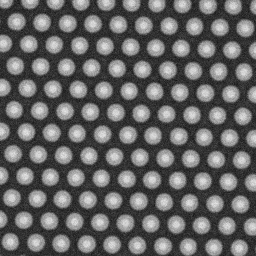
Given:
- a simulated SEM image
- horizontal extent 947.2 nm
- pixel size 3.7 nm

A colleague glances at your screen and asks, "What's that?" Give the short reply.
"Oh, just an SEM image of an array of small figures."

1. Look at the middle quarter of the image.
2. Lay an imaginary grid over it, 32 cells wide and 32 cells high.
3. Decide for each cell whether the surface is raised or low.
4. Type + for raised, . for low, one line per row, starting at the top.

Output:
+++..++++..++++...++++..++++...+
+++..++++..++++...++++..++++..++
++...+++....+++...+++...++++..++
.........................++....+
...+.....+......................
..+++...++++...+++...+++....++..
..++++..++++..++++...++++..++++.
..+++...++++..++++...++++..++++.
.........++....+++...+++...++++.
................................
++...+++....++....++............
++...++++..++++..++++...+++...++
++...++++..++++..++++...++++..++
++...+++...++++...+++...++++..++
...............................+
..++............................
.++++...+++...++++...+++...+++..
.++++...++++..++++..++++...++++.
.++++...++++..++++..++++...++++.
.........++....++....+++...+++..
................................
++...+++...+++....++.....+......
++..++++...++++..++++...+++...++
++..++++...++++..++++..++++...++
+....+++...+++...++++..++++...++
........................++....++
..++............................
.++++...+++...+++....+++...+++..
.++++..++++...++++..++++..++++..
.++++..++++...++++..++++..++++..
........++....+++...+++....+++..
................................